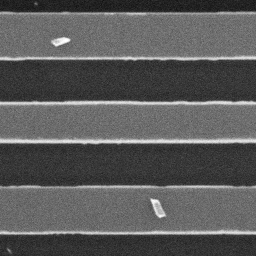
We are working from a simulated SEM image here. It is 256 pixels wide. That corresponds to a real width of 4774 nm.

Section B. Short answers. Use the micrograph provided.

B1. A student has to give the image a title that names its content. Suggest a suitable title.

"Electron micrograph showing lines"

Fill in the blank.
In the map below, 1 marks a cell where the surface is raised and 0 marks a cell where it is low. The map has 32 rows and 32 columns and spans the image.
00000000000000000000000000000000
00000000000000000000000000000000
11111111111111111111111111111111
11111111111111111111111111111111
11111111111111111111111111111111
11111111111111111111111111111111
11111111111111111111111111111111
00000000000000000000000000000000
00000000000000000000000000000000
00000000000000000000000000000000
00000000000000000000000000000000
00000000000000000000000000000000
00000000000000000000000000000000
11111111111111111111111111111111
11111111111111111111111111111111
11111111111111111111111111111111
11111111111111111111111111111111
11111111111111111111111111111111
00000000000000000000000000000000
00000000000000000000000000000000
00000000000000000000000000000000
00000000000000000000000000000000
00000000000000000000000000000000
11111111111111111111111111111111
11111111111111111111111111111111
11111111111111111111111111111111
11111111111111111111111111111111
11111111111111111111111111111111
11111111111111111111111111111111
00000000000000000000000000000000
00000000000000000000000000000000
00000000000000000000000000000000